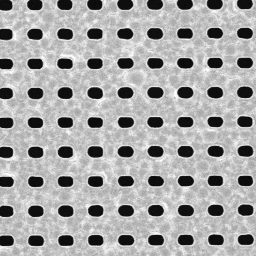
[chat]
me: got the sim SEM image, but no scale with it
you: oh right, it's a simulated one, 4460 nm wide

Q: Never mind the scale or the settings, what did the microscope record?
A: a regular array of holes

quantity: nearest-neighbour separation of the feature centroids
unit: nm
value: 513